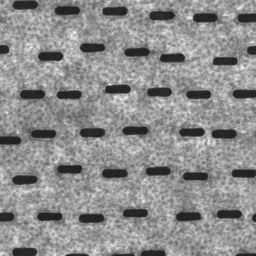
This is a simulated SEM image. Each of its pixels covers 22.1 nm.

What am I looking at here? a regular array of holes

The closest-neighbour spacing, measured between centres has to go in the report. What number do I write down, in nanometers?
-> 927